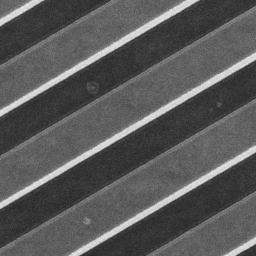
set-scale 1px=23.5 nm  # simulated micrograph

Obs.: lines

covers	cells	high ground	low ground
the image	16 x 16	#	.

##....######....
....######....##
...#####....####
.#####.....#####
#####....######.
###....######...
#.....#####....#
....#####.....##
..######....####
######....######
####.....#####..
###....######...
#....######....#
....#####....###
..#####.....####
######....######